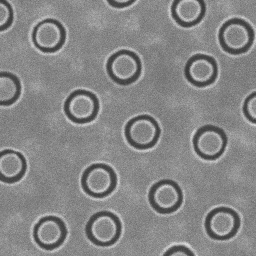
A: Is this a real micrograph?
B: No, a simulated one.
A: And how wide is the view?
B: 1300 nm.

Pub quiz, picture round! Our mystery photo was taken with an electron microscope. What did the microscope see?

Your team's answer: a regular array of ring-shaped grooves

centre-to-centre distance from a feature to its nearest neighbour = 62.5 pixels